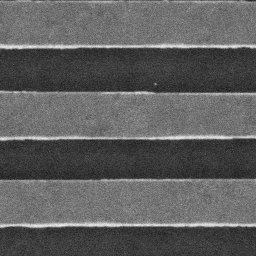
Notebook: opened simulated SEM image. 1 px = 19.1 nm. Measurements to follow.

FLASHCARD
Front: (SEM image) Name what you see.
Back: lines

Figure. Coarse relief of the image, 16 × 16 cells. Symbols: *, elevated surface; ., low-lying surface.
****************
****************
****************
................
................
................
****************
****************
****************
................
................
****************
****************
****************
................
................